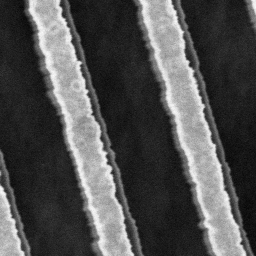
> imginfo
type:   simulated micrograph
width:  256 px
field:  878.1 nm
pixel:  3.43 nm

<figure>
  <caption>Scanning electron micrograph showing lines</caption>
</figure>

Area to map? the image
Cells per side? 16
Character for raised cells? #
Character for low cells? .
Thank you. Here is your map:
..##.....##.....
..###....###....
..###....###....
...##.....##....
...###....###...
...###....###...
....##.....##...
....##.....##...
....###....###..
.....##.....##..
.....##.....##..
#....###....###.
#....###....###.
#.....##.....##.
#.....###....##.
##....###....###